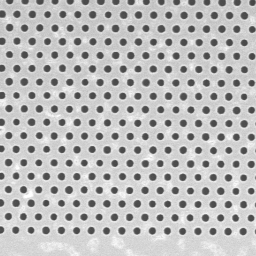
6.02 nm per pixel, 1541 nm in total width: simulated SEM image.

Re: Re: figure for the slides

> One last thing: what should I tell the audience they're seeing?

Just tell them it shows a regular array of holes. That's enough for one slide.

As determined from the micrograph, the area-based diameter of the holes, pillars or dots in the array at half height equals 42.9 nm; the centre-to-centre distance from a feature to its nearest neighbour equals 14.8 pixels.